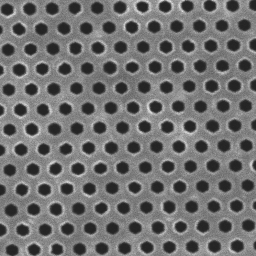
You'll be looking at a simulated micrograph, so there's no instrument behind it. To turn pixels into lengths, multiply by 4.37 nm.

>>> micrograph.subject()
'a regular array of holes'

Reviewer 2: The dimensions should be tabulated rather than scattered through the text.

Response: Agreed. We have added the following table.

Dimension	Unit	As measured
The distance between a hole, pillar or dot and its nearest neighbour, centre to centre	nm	97.6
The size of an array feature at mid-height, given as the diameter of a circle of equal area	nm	51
